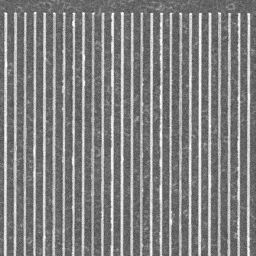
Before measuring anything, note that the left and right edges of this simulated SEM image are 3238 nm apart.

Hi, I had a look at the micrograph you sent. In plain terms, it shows parallel lines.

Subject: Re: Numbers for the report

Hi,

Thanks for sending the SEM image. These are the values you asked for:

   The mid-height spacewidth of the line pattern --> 101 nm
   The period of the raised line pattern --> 0.123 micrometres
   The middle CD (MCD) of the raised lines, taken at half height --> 23.7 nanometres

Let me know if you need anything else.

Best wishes